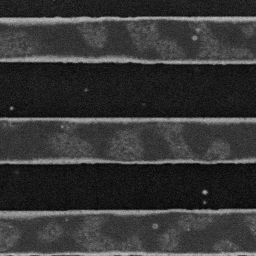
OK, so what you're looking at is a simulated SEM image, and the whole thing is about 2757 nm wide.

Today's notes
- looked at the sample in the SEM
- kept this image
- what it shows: lines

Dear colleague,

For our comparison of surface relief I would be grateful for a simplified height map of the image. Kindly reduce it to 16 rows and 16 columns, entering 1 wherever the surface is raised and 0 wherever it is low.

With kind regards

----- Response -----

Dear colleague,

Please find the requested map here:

0000000000000000
1111111111111111
1111111111111111
1111111111111111
0000000000000000
0000000000000000
0000000000000000
1111111111111111
1111111111111111
1111111111111111
0000000000000000
0000000000000000
0000000000000000
1111111111111111
1111111111111111
1111111111111111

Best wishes